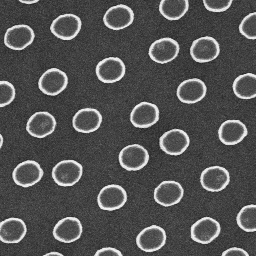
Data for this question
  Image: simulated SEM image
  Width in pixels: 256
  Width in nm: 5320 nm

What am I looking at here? a regular array of raised bodies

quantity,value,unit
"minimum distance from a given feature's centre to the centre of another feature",0.955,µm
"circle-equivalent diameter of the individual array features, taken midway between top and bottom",532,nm